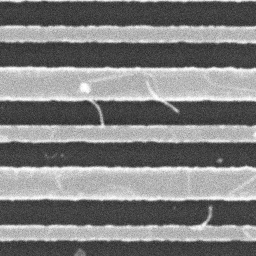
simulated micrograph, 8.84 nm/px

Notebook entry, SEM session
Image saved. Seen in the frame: lines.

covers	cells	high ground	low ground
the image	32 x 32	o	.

................................
................................
................................
oooooooooooooooooooooooooooooooo
oooooooooooooooooooooooooooooooo
................................
................................
................................
ooooo..oo....o...o.....oo.......
oooooooooooooooooooooooooooooooo
oooooooooooooooooooooooooooooooo
oooooooooooooooooooooooooooooooo
...ooo.ooooo.ooo...oooooo..oo..o
................................
................................
................................
oooooooooooooooooooooooooooooooo
oooooooooooooooooooooooooooooooo
................................
................................
................................
oooooooooooooooooooooooooooooooo
oooooooooooooooooooooooooooooooo
oooooooooooooooooooooooooooooooo
oooooooooooooooooooooooooooooooo
................................
................................
................................
oooooooooooooooooooooooooooooooo
oooooooooooooooooooooooooooooooo
................................
................................